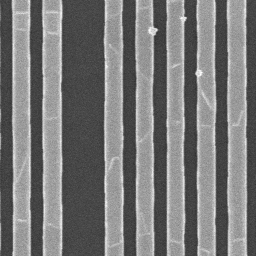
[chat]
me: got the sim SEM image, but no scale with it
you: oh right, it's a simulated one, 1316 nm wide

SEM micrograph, wiring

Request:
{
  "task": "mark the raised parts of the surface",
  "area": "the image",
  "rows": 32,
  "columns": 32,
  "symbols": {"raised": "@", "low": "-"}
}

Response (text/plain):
--@@-@@@-----@@--@@--@@--@@--@@-
--@@-@@@-----@@--@@--@@--@@--@@-
--@@-@@@-----@@--@@--@@--@@--@@-
--@@-@@@-----@@--@@--@@--@@--@@-
--@@--@@-----@@--@@--@@--@@--@@-
--@@-@@@-----@@--@@--@@--@@--@@-
--@@-@@@-----@@--@@--@@--@@--@@-
--@@-@@@-----@@--@@--@@--@@--@@-
--@@-@@@-----@@--@@--@@--@@--@@-
--@@-@@@-----@@--@@--@@--@@--@@-
--@@--@@-----@@--@@--@@--@@--@@-
--@@--@@-----@@--@@--@@--@@--@@-
--@@-@@@-----@@--@@--@@--@@--@@-
--@@-@@@-----@@--@@--@@--@@--@@-
--@@-@@@-----@@--@@--@@--@@--@@-
--@@-@@@-----@@--@@--@@--@@--@@-
--@@-@@@-----@@--@@--@@--@@--@@-
--@@-@@@-----@@--@@--@@--@@--@@-
--@@-@@@-----@@--@@--@@--@@--@@-
--@@--@@-----@@--@@--@@--@@--@@-
--@@--@@-----@@--@@--@@--@@--@@-
--@@--@@-----@@--@@--@@--@@--@@-
--@@--@@-----@@--@@--@@--@@--@@-
--@@--@@-----@@--@@--@@--@@--@@-
--@@--@@-----@@--@@--@@--@@--@@-
--@@--@@-----@@--@@--@@--@@--@@-
--@@--@@-----@@--@@--@@--@@--@@-
--@@--@@-----@@--@@--@@--@@--@@-
--@@--@@-----@@--@@--@@--@@--@@-
--@@--@@-----@@--@@--@@--@@--@@-
--@@--@@-----@@--@@--@@--@@--@@-
--@@--@@-----@@--@@--@@--@@--@@-